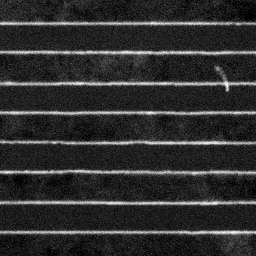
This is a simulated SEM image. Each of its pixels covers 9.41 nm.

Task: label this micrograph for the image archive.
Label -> lines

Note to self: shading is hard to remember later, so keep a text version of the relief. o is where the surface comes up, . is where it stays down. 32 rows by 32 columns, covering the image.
oooooooooooooooooooooooooooooooo
oooooooooooooooooooooooooooooooo
oooooooooooooooooooooooooooooooo
................................
................................
................................
...oooo.........................
oooooooooooooooooooooooooooooooo
oooooooooooooooooooooooooooooooo
oooooooooooooooooooooooooooooooo
..o.oo................o.....o...
................................
................................
................................
oooooooooooooooooooooooooooooooo
oooooooooooooooooooooooooooooooo
oooooooooooooooooooooooooooooooo
oooooooooooooooooooooooooooooooo
................................
................................
................................
.......ooooo....................
oooooooooooooooooooooooooooooooo
oooooooooooooooooooooooooooooooo
oooooooooooooooooooooooooooooooo
................................
................................
................................
................................
oooooooooooooooooooooooooooooooo
oooooooooooooooooooooooooooooooo
oooooooooooooooooooooooooooooooo